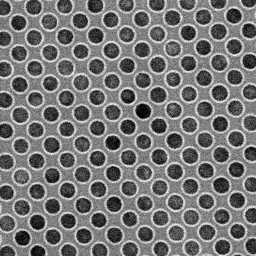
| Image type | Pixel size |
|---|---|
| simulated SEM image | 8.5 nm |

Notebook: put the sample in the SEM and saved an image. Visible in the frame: a regular array of holes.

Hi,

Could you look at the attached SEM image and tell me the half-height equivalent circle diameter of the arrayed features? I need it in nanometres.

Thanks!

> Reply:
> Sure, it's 142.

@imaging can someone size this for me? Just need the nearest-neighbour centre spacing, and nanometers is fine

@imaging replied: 183